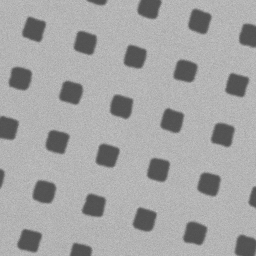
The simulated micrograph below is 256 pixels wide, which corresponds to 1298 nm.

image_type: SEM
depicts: a regular array of holes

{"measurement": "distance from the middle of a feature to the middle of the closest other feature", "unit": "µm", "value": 0.258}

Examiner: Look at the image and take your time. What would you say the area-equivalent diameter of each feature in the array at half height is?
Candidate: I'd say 116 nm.